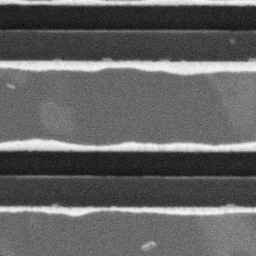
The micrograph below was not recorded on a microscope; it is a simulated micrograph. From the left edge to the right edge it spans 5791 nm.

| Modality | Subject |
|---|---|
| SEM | lines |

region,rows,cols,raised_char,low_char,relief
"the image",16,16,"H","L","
LLLLLLLLLLLLLLLL
LLLLLLLLLLLLLLLL
LLLLLLLLLLLLLLLL
LLLLLLLLLLLLLLLL
HHHHHHHHHHHHHHHH
HHHHHHHHHHHHHHHH
HHHHHHHHHHHHHHHH
HHHHHHHHHHHHHHHH
HHHHHHHHHHHHHHHH
LLLLLLLLLLLLLLLL
LLLLLLLLLLLLLLLL
LLLLLLLLLLLLLLLL
LLLLLLLLLLLLLLLL
HHHHHHHHHHHHHHHH
HHHHHHHHHHHHHHHH
HHHHHHHHHHHHHHHH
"